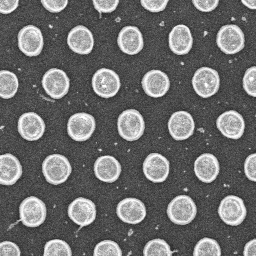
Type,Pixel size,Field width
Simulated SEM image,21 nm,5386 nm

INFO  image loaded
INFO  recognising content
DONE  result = a regular array of raised bodies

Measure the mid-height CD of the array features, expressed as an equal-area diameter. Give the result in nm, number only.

548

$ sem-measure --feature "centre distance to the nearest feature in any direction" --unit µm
1.03